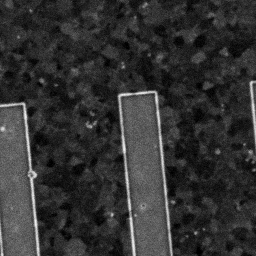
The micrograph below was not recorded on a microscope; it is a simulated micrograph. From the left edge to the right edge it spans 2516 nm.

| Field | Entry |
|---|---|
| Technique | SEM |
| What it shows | one or a few lines or trenches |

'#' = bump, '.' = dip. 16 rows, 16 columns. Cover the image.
################
################
################
################
################
################
########..######
..######..######
..######..######
..######..######
..######..######
..######..######
..######..######
..######..######
..######...#####
..######...#####